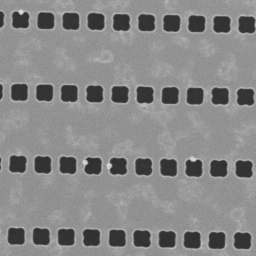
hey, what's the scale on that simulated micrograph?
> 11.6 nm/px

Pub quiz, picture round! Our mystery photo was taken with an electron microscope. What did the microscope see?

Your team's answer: a regular array of holes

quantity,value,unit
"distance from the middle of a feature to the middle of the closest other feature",290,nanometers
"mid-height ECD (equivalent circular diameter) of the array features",213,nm